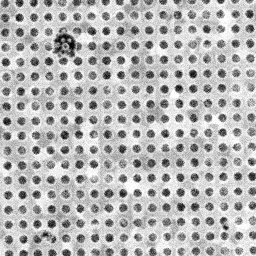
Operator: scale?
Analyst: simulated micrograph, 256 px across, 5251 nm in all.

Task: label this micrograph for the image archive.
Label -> a regular array of holes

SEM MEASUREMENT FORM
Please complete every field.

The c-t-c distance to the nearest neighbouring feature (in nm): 293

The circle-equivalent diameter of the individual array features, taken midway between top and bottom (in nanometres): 200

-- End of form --